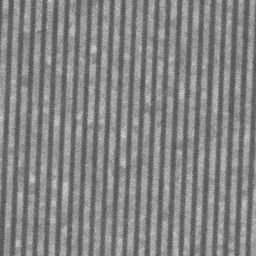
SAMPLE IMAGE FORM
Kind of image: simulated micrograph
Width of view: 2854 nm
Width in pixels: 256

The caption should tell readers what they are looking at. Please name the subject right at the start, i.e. parallel lines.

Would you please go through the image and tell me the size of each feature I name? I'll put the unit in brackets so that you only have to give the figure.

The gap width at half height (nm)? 68.2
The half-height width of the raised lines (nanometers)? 57.1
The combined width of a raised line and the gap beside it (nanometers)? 125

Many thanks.